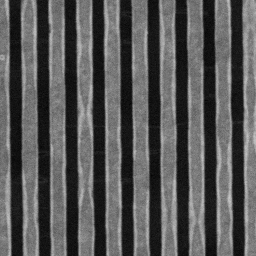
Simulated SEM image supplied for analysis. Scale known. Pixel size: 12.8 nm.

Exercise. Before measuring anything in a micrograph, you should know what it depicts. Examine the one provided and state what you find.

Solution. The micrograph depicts wiring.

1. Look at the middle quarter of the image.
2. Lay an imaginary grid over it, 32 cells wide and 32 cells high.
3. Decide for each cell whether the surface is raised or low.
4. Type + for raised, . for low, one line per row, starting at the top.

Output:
....+++...++++...++++...+++....+
....+++...++++...++++...+++....+
....+++...++++...++++...+++....+
....+++...++++...++++...+++....+
....+++...++++...++++...+++....+
....+++...++++...++++...+++....+
....+++...++++...++++...+++....+
....+++....+++...++++...+++.....
....+++....+++...++++...+++.....
....+++....+++...++++...+++.....
....+++....+++...++++...+++.....
....++.....+++...++++...+++.....
....++.....+++...++++...++++....
....+++....+++....+++...++++....
....+++....+++....+++...++++....
....+++....+++....+++...++++...+
....+++....+++....+++...++++...+
....+++....+++....+++...++++...+
....+++....+++....+++...++++...+
....+++....+++....+++....+++...+
....+++....+++....+++....+++...+
....+++....+++....+++....+++...+
....+++....+++....+++....+++....
....+++....+++....+++...++++....
....+++....+++....+++...++++....
....+++....+++....+++...++++....
....+++....+++....+++...++++....
....+++....+++....+++...++++....
....+++....+++....+++...++++....
....+++....+++....+++...++++....
....+++....+++....+++....+++....
....+++....+++....+++....+++....